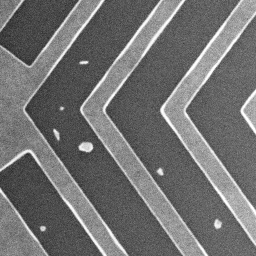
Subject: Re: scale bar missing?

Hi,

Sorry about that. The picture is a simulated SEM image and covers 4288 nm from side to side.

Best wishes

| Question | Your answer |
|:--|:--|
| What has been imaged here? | groups of lines, slits or small figures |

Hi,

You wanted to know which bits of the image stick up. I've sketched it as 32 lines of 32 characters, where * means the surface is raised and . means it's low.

***.......***.......***.......**
**.......***.......***.......***
*.......***.......***.......***.
.......***........**........***.
.......***.......**........***..
......***.......***.......***...
*....***.......***.......***....
**..***........***.......***....
*******.......***.......***.....
******.......***.......***......
*****.......***.......***.......
****........**........***.......
****.......***.......***.......*
***.......***.......***.......**
****.......**........**........*
****.......***.......***.......*
*****.......***.......***.......
******.......***.......***......
******....*..***.......***......
**..***.......***.......***.....
*....***.......***.......***....
......**........**........**....
......***.......***.......***...
.......***.......***.......***..
*.......***.......***.......***.
*........**.......***.......***.
**.......***.......***.......***
***.......***.......***.......**
***........**........**.......**
****.......***.......***.......*
*****.......***.......***.......
******.......***.......***......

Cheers